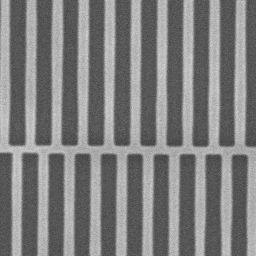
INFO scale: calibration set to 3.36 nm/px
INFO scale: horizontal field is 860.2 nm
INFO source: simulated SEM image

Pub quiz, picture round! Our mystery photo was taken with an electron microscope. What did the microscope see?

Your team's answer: groups of lines, slits or small figures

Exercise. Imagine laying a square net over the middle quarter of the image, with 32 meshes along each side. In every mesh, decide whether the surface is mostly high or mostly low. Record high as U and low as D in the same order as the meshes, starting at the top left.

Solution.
DDDDUUDDDDUUDDDDDUUDDDDUUDDDDDUU
DDDDUUDDDDUUDDDDDUUDDDDUUDDDDDUU
DDDDUUDDDDUUDDDDDUUDDDDUUDDDDDUU
DDDDUUDDDDUUDDDDDUUDDDDUUDDDDDUU
DDDDUUDDDDUUDDDDDUUDDDDUUDDDDDUU
DDDDUUDDDDUUDDDDDUUDDDDUUDDDDDUU
DDDDUUDDDDUUDDDDDUUDDDDUUDDDDDUU
DDDDUUDDDDUUDDDDDUUDDDDUUDDDDDUU
DDDDUUDDDDUUDDDDDUUDDDDUUDDDDDUU
DDDDUUDDDDUUDDDDDUUDDDDUUDDDDDUU
DDDDUUDDDDUUDDDDDUUDDDDUUDDDDDUU
DDDDUUDDDDUUDDDDDUUDDDDUUDDDDDUU
DDDDUUDDDDUUDDDDDUUDDDDUUDDDDDUU
DDDDUUDDDDUUDDDDDUUDDDDUUDDDDDUU
DDDDUUDDDDUUDDDDDUUDDDDUUDDDDDUU
DDDDUUDDDDUUDDDDDUUDDDDUUDDDDDUU
DDDDUUDDDDUUDDDDDUUDDDDUUDDDDDUU
DDDDUUDDDDUUDDDDDUUDDDDUUDDDDDUU
DDDDUUDDDDUUDDDDDUUDDDDUUDDDDDUU
DDDDUUDDDDUUDDDDDUUDDDDUUDDDDDUU
DDDUUUDDDDUUUDDDUUUDDDDUUUDDDDUU
UUUUUUUUUUUUUUUUUUUUUUUUUUUUUUUU
UUUDDDUUUDDDDUUUDDDUUUUDDDUUUDDD
UUDDDDDUUDDDDDUUDDDDUUDDDDUUUDDD
UUDDDDDUUDDDDDUUDDDDUUDDDDUUUDDD
UUDDDDDUUDDDDDUUDDDDUUDDDDUUUDDD
UUDDDDDUUDDDDDUUDDDDUUDDDDUUUDDD
UUDDDDDUUDDDDDUUDDDDUUDDDDUUUDDD
UUDDDDDUUDDDDDUUDDDDUUDDDDUUUDDD
UUDDDDDUUDDDDUUUDDDDUUDDDDUUUDDD
UUDDDDDUUDDDDUUUDDDDUUDDDDUUUDDD
UUDDDDDUUDDDDUUUDDDDUUDDDDUUUDDD